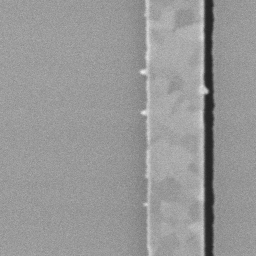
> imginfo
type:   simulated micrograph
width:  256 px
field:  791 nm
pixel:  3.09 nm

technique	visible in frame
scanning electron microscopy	lines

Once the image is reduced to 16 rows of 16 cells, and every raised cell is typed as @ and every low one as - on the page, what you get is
---------@@@@---
---------@@@@---
---------@@@@---
---------@@@@---
---------@@@@---
---------@@@@---
---------@@@@---
---------@@@@---
---------@@@@---
---------@@@@---
---------@@@@---
---------@@@@---
---------@@@@---
---------@@@@---
---------@@@@---
---------@@@@---